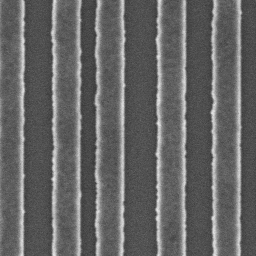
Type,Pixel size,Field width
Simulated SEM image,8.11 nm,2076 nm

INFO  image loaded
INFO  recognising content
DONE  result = lines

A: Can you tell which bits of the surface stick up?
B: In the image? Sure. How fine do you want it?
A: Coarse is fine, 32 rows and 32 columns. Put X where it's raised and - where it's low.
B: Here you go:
XXX----XXX--XXX-----XXX----XXX--
XXX----XXX--XXX-----XXX----XXX--
XXX----XXX--XXX-----XXX----XXX--
XXX----XXX--XXX-----XXX----XXX--
XXX---XXXX--XXXX----XXX----XXX--
XXX----XXX--XXX-----XXX----XXX--
XXX----XXX--XXX-----XXX----XXX--
XXX----XXX--XXX-----XXX----XXX--
XXX----XXX--XXX-----XXX----XXX--
XXX----XXX--XXX-----XXX----XXX--
XXX----XXX--XXXX----XXX----XXX--
XXX----XXX--XXX-----XXX----XXX--
XXX----XXX--XXX-----XXX----XXX--
XXX----XXX--XXX-----XXX----XXX--
XXX----XXX--XXX-----XXX----XXX--
XXX----XXX--XXX-----XXX----XXX--
XXX----XXX--XXX-----XXX----XXX--
XXX----XXX--XXX-----XXX----XXX--
XXX----XXX--XXX-----XXX----XXX--
XXX----XXX--XXX-----XXX----XXX--
XXX----XXX--XXX-----XXX----XXX--
XXX----XXX--XXX-----XXX----XXX--
XXX----XXX--XXX-----XXX----XXX--
XXX----XXX--XXX-----XXX----XXX--
XXX----XXX--XXX-----XXX----XXX--
XXX----XXX--XXX-----XXX----XXX--
XXX----XXX--XXX-----XXX----XXX--
XXX----XXX--XXX-----XXX----XXX--
XXX----XXX--XXX-----XXX----XXX--
XXX----XXX--XXX-----XXX----XXX--
XXX----XXX--XXX-----XXX----XXX--
XXX----XXX--XXX-----XXX----XXX--